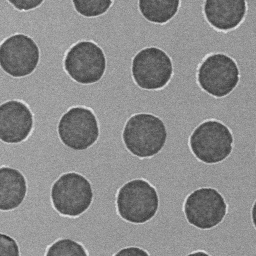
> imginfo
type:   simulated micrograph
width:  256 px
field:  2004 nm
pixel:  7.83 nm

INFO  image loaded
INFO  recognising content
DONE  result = a regular array of holes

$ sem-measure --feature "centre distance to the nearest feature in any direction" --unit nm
520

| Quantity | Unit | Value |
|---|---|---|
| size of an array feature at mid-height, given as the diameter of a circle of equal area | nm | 323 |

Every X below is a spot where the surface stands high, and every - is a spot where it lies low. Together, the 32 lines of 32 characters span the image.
XX---XXXX-----XXX-----XXXX-----X
XXXXXXXXXX---XXXXX----XXXX-----X
XXXXXXXXXXXXXXXXXXX--XXXXX----XX
XXXXXXXXXXXXXXXXXXXXXXXXXXX--XXX
XX-XXXXXXXXXXXXXXXXXXXXXXXXXXXXX
----XXXXXX--XXXXXXXXXXXXXXXXXXXX
-----XXXX----XXXX---XXXXXXXXXXXX
-----XXX-----XXXX----XXXXX---XXX
----XXXX-----XXXX-----XXX-----XX
XX-XXXXXX----XXXX----XXXX-----XX
XXXXXXXXXXXXXXXXX----XXXX-----XX
XXXXXXXXXXXXXXXXXXXXXXXXXX---XXX
XXXXXXXXXXXXXXXXXXXXXXXXXXXXXXXX
---XXXXXX-XXXXXXXXXXXXXXXXXXXXXX
----XXXX----XXXXX--XXXXXXXXXXXXX
----XXX-----XXXX----XXXXX---XXXX
----XXX-----XXX------XXX-----XXX
---XXXXX----XXX------XXX-----XXX
XXXXXXXXX--XXXXX----XXXX-----XXX
XXXXXXXXXXXXXXXXX--XXXXXX---XXXX
XXXXXXXXXXXXXXXXXXXXXXXXXXXXXXXX
--XXXXXXXXXXXXXXXXXXXXXXXXXXXXXX
---XXXX----XXXXXX-XXXXXXXXXXXXXX
---XXXX----XXXX----XXXXXXXXXXXXX
---XXX------XXX-----XXXX----XXXX
---XXXX----XXXX-----XXX-----XXXX
XXXXXXX---XXXXX----XXXX-----XXXX
XXXXXXXXXXXXXXXX---XXXX-----XXXX
XXXXXXXXXXXXXXXXXXXXXXXXX-XXXXXX
-XXXXXXXXXXXXXXXXXXXXXXXXXXXXXXX
--XXXXX---XXXXXXXXXXXXXXXXXXXXXX
--XXXX-----XXXX---XXXXXXXXXXXXXX